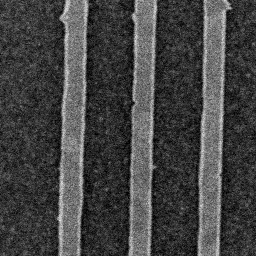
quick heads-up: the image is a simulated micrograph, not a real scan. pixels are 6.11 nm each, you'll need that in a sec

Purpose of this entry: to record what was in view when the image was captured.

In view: one or a few lines or trenches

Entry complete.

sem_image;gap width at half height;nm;308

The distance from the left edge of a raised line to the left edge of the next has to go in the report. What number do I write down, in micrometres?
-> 0.424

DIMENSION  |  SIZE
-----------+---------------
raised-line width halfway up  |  19.4 pixels